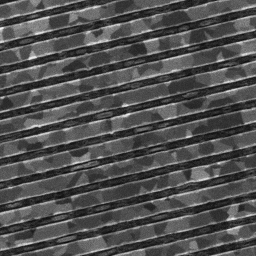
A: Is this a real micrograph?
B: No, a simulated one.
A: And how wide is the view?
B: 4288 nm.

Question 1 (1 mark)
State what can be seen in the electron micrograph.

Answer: parallel lines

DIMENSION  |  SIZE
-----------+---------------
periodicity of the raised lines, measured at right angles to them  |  376 nm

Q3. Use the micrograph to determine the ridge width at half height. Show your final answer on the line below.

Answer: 230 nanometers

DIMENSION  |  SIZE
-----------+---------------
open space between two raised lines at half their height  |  143 nanometers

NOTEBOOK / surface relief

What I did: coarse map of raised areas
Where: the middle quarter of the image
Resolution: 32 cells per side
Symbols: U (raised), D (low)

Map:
UUUUUUUUUDDDDDDDDDDUUUUUUUUUUUUU
UUUUDDDDDDDDDDUUUUUUUUUUUUUUDDDD
DDDDDDDDDDUUUUUUUUUUUUUUUDDDDDDD
DDDDDDUUUUUUUUUUUUUUUDDDDDDDDDUU
DUUUUUUUUUUUUUUUDDDDDDDDDDUUUUUU
UUUUUUUUUUUUDDDDDDDDDDUUUUUUUUUU
UUUUUUUUDDDDDDDDDDUUUUUUUUUUUUUU
UUUDDDDDDDDDDUUUUUUUUUUUUUUUDDDD
DDDDDDDDDUUUUUUUUUUUUUUUDDDDDDDD
DDDDDUUUUUUUUUUUUUUDDDDDDDDDDDUU
UUUUUUUUUUUUUUUDDDDDDDDDDUUUUUUU
UUUUUUUUUUDDDDDDDDDDDUUUUUUUUUUU
UUUUUUDDDDUDDDDDUUUUUUUUUUUUUUUD
UUDDDDDDDDDDUUUUUUUUUUUUUUUUDDDD
DDDDDDDDUUUUUUUUUUUUUUUDDDDDDDDD
DDDUUUUUUUUUUUUUUUDDDDDDDDDDUUUU
UUUUUUUUUUUUUUDDDDDDDDDDUUUUUUUU
UUUUUUUUUUDDDDDDDDDDUUUUUUUUUUUU
UUUUUDDDDDDDDDDUUUUUUUUUUUUUUUDD
UDDDDDDDDDDUUUUUUUUUUUUUUUDDDDDD
DDDDDDDUUUUUUUUUUUUUUDDDDDDDDDDU
DDUUUUUUUUUUUUUUUDDDDDDDDDDUUUUU
UUUUUUUUUUUUUDDDDDDDDDUUUUUUUUUU
UUUUUUUUUDDDDDDDDDUUUUUUUUUUUUUU
UUUUDDDUDDDDDDUUUUUUUUUUUUUUUUDD
UDDDDUUDDDUUUUUUUUUUUUUUUDDDDDDD
DDDDDUUUUUUUUUUUUUUUUDDDDDDDDDUU
DUUUUUUUUUUUUUUUDDDDDDDDDDUUUUUU
UUUUUUUUUUUUDDDDDDDDDDUUUUUUUUUU
UUUUUUUDDDDDDDDDDUUUUUUUUUUUUUUD
UUUUDDDDDDDDDUUUUUUUUUUUUUUUDDDD
DDDDDDDDDUUUUUUUUUUUUUUUDDDDDDDD